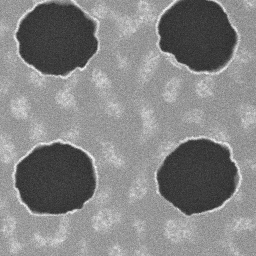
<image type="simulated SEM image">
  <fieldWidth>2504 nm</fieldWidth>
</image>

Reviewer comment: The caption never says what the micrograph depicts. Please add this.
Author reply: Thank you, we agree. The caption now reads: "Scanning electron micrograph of holes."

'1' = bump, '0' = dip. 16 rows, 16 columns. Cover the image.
1100011111100011
1000001111000011
1000001111000001
1000001111100011
1110111111111111
1111111111111111
1111111111111111
1111111111111111
1111111111111111
1100011111100011
1000001111000001
1000001111000001
1000001111000011
1111111111111111
1111111111111111
1111111111111111